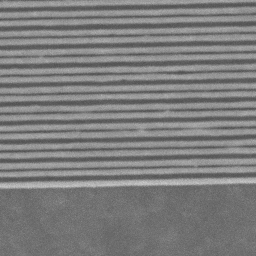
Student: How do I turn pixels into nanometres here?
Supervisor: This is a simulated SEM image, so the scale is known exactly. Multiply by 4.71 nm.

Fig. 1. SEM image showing parallel lines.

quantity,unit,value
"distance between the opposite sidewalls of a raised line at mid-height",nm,27.1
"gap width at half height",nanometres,22.4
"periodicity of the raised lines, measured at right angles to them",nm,44.5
